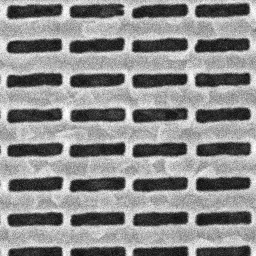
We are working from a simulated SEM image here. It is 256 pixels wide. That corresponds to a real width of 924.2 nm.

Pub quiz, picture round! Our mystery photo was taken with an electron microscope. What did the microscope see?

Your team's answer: a regular array of holes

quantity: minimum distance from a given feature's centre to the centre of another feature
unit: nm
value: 124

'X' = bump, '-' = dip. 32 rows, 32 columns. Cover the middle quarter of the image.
XXXXXXXXXXXXXXXXXXXXXXXXXXXXXXXX
XXXXXXXXXXXXXXXXXXXXXXXXXXXXXXXX
XXX------------XXX------------XX
XX-------------XX--------------X
X--------------XX--------------X
XX------------XXX--------XXXXXXX
XXXXXXXXXXXXXXXXXXXXXXXXXXXXXXXX
XXXXXXXXXXXXXXXXXXXXXXXXXXXXXXXX
XXXXXXXXXXXXXXXXXXXXXXXXXXXXXXXX
XXXXXXXXXXXXXXXXXXXXXXXXXXXXXXXX
XXXXXXXXXXXXXXXXXXXXXXXXXXXXXXXX
XX-------------XX--------------X
XX-------------XX--------------X
XX-------------XX--------------X
XX----XXXX---XXXX-------XXXXXXXX
XXXXXXXXXXXXXXXXXXXXXXXXXXXXXXXX
XXXXXXXXXXXXXXXXXXXXXXXXXXXXXXXX
XXXXXXXXXXXXXXXXXXXXXXXXXXXXXXXX
XXXXXXXXXXXXXXXXXXXXXXXXXXXXXXXX
XXXXXXXXXXXXXX-XXXXXXXXXXXXXXXXX
XX-------------XX--------------X
X--------------XX--------------X
X--------------XX-------------XX
XXXXXXXXXXXXXXXXXXXXXXXXXXXXXXXX
XXXXXXXXXXXXXXXXXXXXXXXXXXXXXXXX
XXXXXXXXXXXXXXXXXXXXXXXXXXXXXXXX
XXXXXXXXXXXXXXXXXXXXXXXXXXXXXXXX
XXXXXXXXXXXXXXXXXXXXXXXXXXXXXXXX
XXXXXXXX-------XXXXXXXXX-------X
XX--------------X--------------X
X--------------XX--------------X
X--------------XX-------------XX